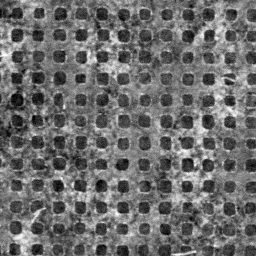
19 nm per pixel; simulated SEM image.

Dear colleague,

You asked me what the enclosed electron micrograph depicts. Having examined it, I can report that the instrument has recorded a regular array of raised bodies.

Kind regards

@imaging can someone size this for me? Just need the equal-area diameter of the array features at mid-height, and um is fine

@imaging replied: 0.268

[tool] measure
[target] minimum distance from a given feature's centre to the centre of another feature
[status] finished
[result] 396 nm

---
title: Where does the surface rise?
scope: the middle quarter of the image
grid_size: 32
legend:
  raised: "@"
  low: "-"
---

--------------------------------
--------------------------------
---@@---@@@--@@@---@@---@@@---@@
@--@@---@@@--@@@---@@@--@@@---@@
---@@---@@@--@@@---@@@--@@@--@@@
-------------------------------@
--------------------------------
---@@----@@---@-----------------
---@@@--@@@---@@---@@@--@@@---@@
---@@@--@@@---@@---@@@--@@@---@@
---@@----@----@@---@@---@@@---@-
--------------------------------
--------------------------------
---@@@--@@@---@@@--@@@--@@@--@@@
---@@@--@@@--@@@@--@@@--@@@--@@@
---@@---@@@---@@@--@@@--@@@--@@@
--------------------------------
--------------------------------
---@@@--@@@---@@---@@---@@@---@@
---@@@--@@@--@@@---@@@--@@@--@@@
---@@@--@@@--@@@---@@@--@@@--@@@
--------------@----@@----@------
--------------------------------
------------------------------@@
@--@@@--@@@--@@@---@@@--@@@--@@@
@--@@@--@@@--@@@---@@@--@@@--@@@
---@@--------@@@---@@---@@---@@@
--------------------------------
--------------------------------
--@@@@--@@@--@@@---@@@--@@@---@@
--@@@@--@@@--@@@---@@@--@@@--@@@
---@@---@@@--@@@---@@@--@@@--@@@